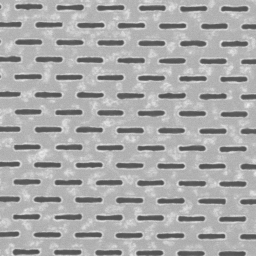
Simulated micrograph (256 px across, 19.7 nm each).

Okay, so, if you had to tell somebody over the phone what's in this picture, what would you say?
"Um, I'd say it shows a regular array of holes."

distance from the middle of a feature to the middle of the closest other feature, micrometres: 0.517